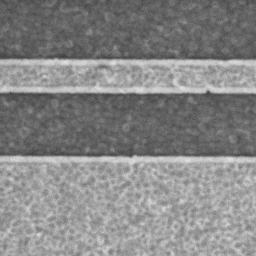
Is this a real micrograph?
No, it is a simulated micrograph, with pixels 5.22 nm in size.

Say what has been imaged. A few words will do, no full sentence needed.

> one or a few lines or trenches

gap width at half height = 354 nm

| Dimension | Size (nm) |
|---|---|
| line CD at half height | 153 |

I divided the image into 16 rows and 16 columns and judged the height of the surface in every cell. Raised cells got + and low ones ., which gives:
................
................
................
................
++++++++++++++++
++++++++++++++++
................
................
................
................
++++++++++++++++
++++++++++++++++
++++++++++++++++
++++++++++++++++
++++++++++++++++
++++++++++++++++